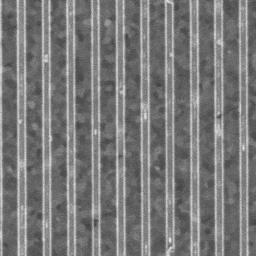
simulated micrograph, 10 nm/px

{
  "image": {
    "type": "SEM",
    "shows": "parallel lines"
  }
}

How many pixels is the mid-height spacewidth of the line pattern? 6.25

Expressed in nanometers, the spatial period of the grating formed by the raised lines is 247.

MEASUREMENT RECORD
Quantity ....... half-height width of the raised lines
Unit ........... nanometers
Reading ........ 184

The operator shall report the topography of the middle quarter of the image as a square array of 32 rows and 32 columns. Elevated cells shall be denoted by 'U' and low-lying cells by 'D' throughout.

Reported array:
UDDUUUUDDUUUUDDUUUUDDUUUUDDUUUUU
UDDUUUUDDUUUUDDUUUUDDUUUUDDUUUUU
UDDUUUUDDUUUUDDUUUUDDUUUUDDUUUUU
UDDUUUUDDUUUUDDUUUUDDUUUUDDUUUUU
UDDUUUUDDUUUUDDUUUUDDUUUUDDUUUUU
UDDUUUUDDUUUUDDUUUUDDUUUUDDUUUUU
UDDUUUUDDUUUUDDUUUUDDUUUUDDUUUUU
UDDUUUUDDUUUUDDUUUUDDUUUUDDUUUUU
UDDUUUUDDUUUUDDUUUUDDUUUUDDUUUUU
UDDUUUUDDUUUUDDUUUUDDUUUUDDUUUUU
UDDUUUUDDUUUUDDUUUUDDUUUUDDUUUUU
UDDUUUUDDUUUUDDUUUUDDUUUUDDUUUUU
UDDUUUUDDUUUUDDUUUUDDUUUUDDUUUUU
UDDUUUUDDUUUUDDUUUUDDUUUUDDUUUUU
UDDUUUUDDUUUUDDUUUUDDUUUUDDUUUUU
UDDUUUUDDUUUUDDUUUUDDUUUUDDUUUUU
UDDUUUUDDUUUUDDUUUUDDUUUUDDUUUUU
UDDUUUUDDUUUUDDUUUUDDUUUUDDUUUUU
UDDUUUUDDUUUUDDUUUUDDUUUUDDUUUUU
UDDUUUUDDUUUUDDUUUUDDUUUUDDUUUUU
UDDUUUUDDUUUUDDUUUUDDUUUUDDUUUUU
UDDUUUUDDUUUUDDUUUUDDUUUUDDUUUUU
UDDUUUUDDUUUUDDUUUUDDUUUUDDUUUUU
UDDUUUUDDUUUUDDUUUUDDUUUUDDUUUUU
UDDUUUUDDUUUUDDUUUUDDUUUUDDDUUUU
UDDUUUUDDUUUUDDUUUUDDUUUUUDDUUUU
UDDUUUUDDUUUUDDUUUUDDUUUUUDUUUUU
UDDUUUUDDUUUUDDUUUUDDUUUUUDUUUUU
UDDUUUUDDUUUUDDUUUUDDUUUUUDUUUUU
UDDUUUUDDUUUUDDUUUUDDUUUUUDUUUUU
UDDUUUUDDUUUUDDUUUUDDUUUUUDUUUUU
UDDUUUUDDUUUUDDUUUUDDUUUUUDUUUUU